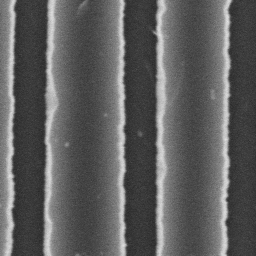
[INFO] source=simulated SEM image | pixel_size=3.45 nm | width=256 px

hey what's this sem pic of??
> lines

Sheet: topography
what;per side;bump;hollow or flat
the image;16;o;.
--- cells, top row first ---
o..ooooo..oooo..
o..ooooo..oooo..
o..ooooo..oooo..
o..ooooo..oooo..
o..ooooo..oooo..
o..ooooo..oooo..
o..ooooo..oooo..
o..ooooo..oooo..
o..ooooo..oooo..
o..ooooo..oooo..
o..ooooo..oooo..
o..ooooo..oooo..
o..ooooo..oooo..
o..ooooo..oooo..
o..ooooo..oooo..
o..ooooo..oooo..